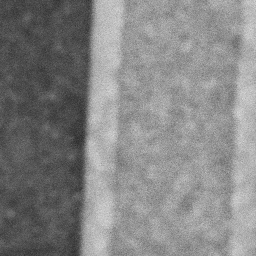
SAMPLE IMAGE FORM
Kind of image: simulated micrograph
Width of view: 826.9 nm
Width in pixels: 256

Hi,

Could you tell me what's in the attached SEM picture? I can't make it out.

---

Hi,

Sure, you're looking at one or a few lines or trenches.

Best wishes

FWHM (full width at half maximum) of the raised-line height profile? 473 nm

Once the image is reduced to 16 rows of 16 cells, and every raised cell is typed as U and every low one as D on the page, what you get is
DDDDDDDUUUUUUUUU
DDDDDDDUUUUUUUUU
DDDDDDDUUUUUUUUU
DDDDDDDUUUUUUUUU
DDDDDDDUUUUUUUUU
DDDDDDDUUUUUUUUU
DDDDDDDUUUUUUUUU
DDDDDDUUUUUUUUUU
DDDDDDUUUUUUUUUU
DDDDDDUUUUUUUUUU
DDDDDDUUUUUUUUUD
DDDDDDUUUUUUUUUD
DDDDDDUUUUUUUUUD
DDDDDDUUUUUUUUUD
DDDDDDUUUUUUUUUD
DDDDDDUUUUUUUUUD